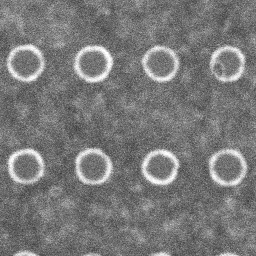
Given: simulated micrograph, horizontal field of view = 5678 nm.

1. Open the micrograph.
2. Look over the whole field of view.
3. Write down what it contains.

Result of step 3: a regular array of raised bodies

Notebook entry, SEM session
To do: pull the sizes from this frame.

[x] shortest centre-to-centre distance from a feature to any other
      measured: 1500 nanometres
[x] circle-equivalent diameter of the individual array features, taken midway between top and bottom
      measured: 0.733 micrometres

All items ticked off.